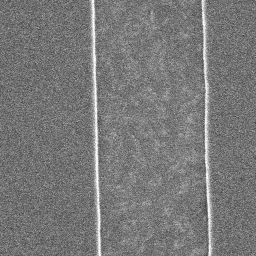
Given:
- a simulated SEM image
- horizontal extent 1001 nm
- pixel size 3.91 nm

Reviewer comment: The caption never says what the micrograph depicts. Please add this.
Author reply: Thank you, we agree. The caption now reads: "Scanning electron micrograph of one or a few lines or trenches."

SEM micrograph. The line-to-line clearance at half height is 427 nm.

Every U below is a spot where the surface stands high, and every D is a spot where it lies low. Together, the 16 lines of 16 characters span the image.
UUUUUUDDDDDDDUUU
UUUUUUDDDDDDDUUU
UUUUUUDDDDDDDUUU
UUUUUUDDDDDDDUUU
UUUUUUDDDDDDDUUU
UUUUUUDDDDDDDUUU
UUUUUUDDDDDDDUUU
UUUUUUDDDDDDDUUU
UUUUUUDDDDDDDUUU
UUUUUUDDDDDDDUUU
UUUUUUDDDDDDDUUU
UUUUUUDDDDDDDUUU
UUUUUUDDDDDDDUUU
UUUUUUDDDDDDDUUU
UUUUUUDDDDDDDUUU
UUUUUUDDDDDDDUUU